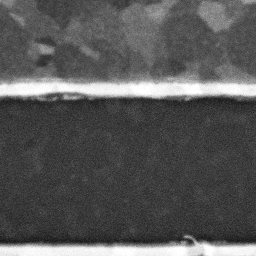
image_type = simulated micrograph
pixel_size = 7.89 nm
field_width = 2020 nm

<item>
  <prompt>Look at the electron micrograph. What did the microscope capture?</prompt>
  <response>one or a few lines or trenches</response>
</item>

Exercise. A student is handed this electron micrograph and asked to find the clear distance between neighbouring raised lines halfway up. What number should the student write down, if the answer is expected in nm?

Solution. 1290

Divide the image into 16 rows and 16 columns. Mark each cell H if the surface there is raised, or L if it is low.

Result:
HHHHHHHHHHHHHHHH
HHHHHHHHHHHHHHHH
HHHHHHHHHHHHHHHH
HHHHHHHHHHHHHHHH
HHHHHHHHHHHHHHHH
HHHLLHHHHHHHHHHH
LLLLLLLLLLLLLLLL
LLLLLLLLLLLLLLLL
LLLLLLLLLLLLLLLL
LLLLLLLLLLLLLLLL
LLLLLLLLLLLLLLLL
LLLLLLLLLLLLLLLL
LLLLLLLLLLLLLLLL
LLLLLLLLLLLLLLLL
LLLLLLLLLLLLLLLL
LLLLLLLLLLLLLLLL